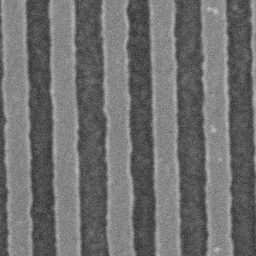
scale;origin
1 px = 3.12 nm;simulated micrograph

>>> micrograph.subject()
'lines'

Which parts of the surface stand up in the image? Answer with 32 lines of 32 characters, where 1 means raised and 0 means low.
11100011100001110001110001110001
11100011100001110001110001110000
11100011100001110001110001110001
11100011100001110001110001110000
11100011100001110001110001110001
11100011100001110001110001110001
01100011100001110001110000110000
11100011100001110001110000110000
01100011100001110001110001110000
11100011100001110001110001110000
11110011100001110001110001110000
11110011100001110001110000110000
11110011110001110001110000111000
01110001110001110001110001111000
01110001110001110001110000110000
01110001110001110001110000111000
01110001110001110001110000111000
01110001110001110001110000111000
01110001110001110001110000111000
01110001110001110001110000111000
01110001110001110001110000111000
01110001110000110001110000111000
01110001110000110001110000111000
01110001110000111001110000111000
01110001110000111001110000111000
01110001110000111000110000111000
01110001110000111001110000111000
01110001110001110000110000111000
01110001110001111000110000111000
01110001110001111000110000111000
01110001110000111000110000111000
01110001110000111000110000111000